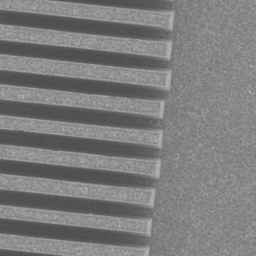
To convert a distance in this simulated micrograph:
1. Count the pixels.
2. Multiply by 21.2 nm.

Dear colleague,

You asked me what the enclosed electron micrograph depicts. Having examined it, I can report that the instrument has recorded parallel lines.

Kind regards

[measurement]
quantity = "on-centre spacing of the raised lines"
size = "628 nanometers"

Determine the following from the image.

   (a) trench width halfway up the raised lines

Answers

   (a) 272 nm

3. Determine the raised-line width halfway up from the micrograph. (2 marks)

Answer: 0.361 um